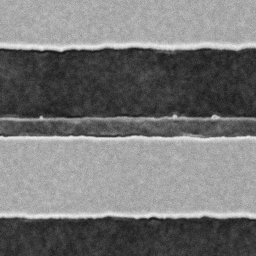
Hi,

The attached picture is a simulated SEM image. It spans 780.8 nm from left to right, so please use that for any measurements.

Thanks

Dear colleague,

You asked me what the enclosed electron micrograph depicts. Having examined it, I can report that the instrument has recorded lines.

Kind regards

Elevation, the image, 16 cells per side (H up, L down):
HHHHHHHHHHHHHHHH
HHHHHHHHHHHHHHHH
HHHHHHHHHHHHHHHH
LLLLLLLLLLLLLLLL
LLLLLLLLLLLLLLLL
LLLLLLLLLLLLLLLL
LLLLLLLLLLLLLLLL
HHHHHHHHHHHHHHHH
HHHHHHHHHHHHHHHH
HHHHHHHHHHHHHHHH
HHHHHHHHHHHHHHHH
HHHHHHHHHHHHHHHH
HHHHHHHHHHHHHHHH
HHHHHHHHHHHHHHHH
LLLLLLLLLLLLLLLL
LLLLLLLLLLLLLLLL